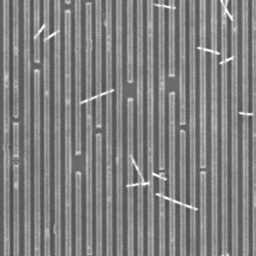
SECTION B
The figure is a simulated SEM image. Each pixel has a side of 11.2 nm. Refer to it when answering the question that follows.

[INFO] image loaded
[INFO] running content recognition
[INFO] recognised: parallel lines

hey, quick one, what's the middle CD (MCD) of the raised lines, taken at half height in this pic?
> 56 nm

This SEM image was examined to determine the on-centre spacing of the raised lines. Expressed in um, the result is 0.116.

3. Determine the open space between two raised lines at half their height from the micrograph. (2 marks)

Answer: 65.8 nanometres